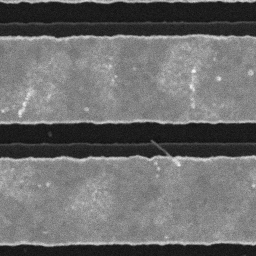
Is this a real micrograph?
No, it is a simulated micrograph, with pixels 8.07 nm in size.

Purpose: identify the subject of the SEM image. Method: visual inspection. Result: lines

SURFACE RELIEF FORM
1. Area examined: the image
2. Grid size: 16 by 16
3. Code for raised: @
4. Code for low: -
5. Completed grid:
----------------
----------------
@@@@@@@@@@@@@@@@
@@@@@@@@@@@@@@@@
@@@@@@@@@@@@@@@@
@@@@@@@@@@@@@@@@
@@@@@@@@@@@@@@@@
@@@@@@@@@@@@@@@@
----------------
----------------
@@@@@@@@@@@@@@@@
@@@@@@@@@@@@@@@@
@@@@@@@@@@@@@@@@
@@@@@@@@@@@@@@@@
@@@@@@@@@@@@@@@@
----------------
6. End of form